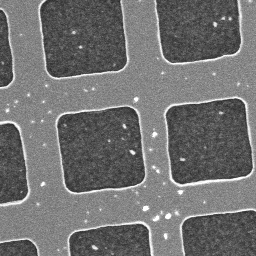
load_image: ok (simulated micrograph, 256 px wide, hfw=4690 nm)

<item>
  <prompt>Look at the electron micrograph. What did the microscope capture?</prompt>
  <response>holes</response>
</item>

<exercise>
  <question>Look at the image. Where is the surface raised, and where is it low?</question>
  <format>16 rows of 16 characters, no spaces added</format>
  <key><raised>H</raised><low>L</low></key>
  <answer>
HHHLLLLLHHLLLLLH
HHHLLLLLHHLLLLLH
LHHLLLLLHHLLLLLH
LHHLLLLLHHLLLLHH
LHHLLLLHHHHHHHHH
HHHHHHHHHHHHHHHH
HHHHHHHHHHHHLLLH
HHHHLLLLLHLLLLLH
LHHHLLLLLHHLLLLL
LHHHLLLLLHHLLLLL
LLHHLLLLLHHLLLLL
LLHHLLLLLHHHHHHH
LHHHHHHHHHHHHHHH
HHHHHHHHHHHHLLLL
HHHHHLLLLHHLLLLL
LLHHLLLLLHHLLLLL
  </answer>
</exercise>